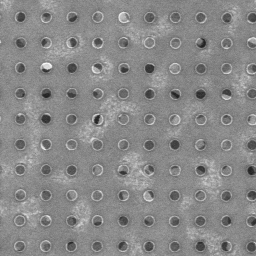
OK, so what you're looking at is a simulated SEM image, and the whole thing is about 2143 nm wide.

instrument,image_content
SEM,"a regular array of raised bodies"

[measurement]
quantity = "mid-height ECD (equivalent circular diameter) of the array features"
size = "90.1 nm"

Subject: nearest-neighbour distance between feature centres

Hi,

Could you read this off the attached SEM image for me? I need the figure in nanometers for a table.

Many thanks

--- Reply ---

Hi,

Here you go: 212